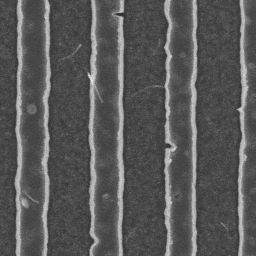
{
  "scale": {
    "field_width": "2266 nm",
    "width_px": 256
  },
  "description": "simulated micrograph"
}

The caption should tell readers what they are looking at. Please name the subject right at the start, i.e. one or a few lines or trenches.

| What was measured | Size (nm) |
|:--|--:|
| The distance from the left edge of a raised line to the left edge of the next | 656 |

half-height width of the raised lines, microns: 0.252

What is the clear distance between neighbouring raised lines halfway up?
403 nm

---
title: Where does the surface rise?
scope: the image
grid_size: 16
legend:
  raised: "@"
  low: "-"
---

-@@---@@--@@---@
-@@---@@---@---@
-@@---@@--@@---@
-@@---@@--@@---@
-@@---@@--@@---@
-@@---@@--@@---@
-@@---@@--@@---@
-@@---@@--@@---@
-@@---@@--@@---@
-@@---@@---@---@
-@@---@@--@@---@
-@@---@@--@@---@
-@@---@@--@@---@
-@@---@@--@@---@
-@@---@----@---@
-@@---@@--@@---@